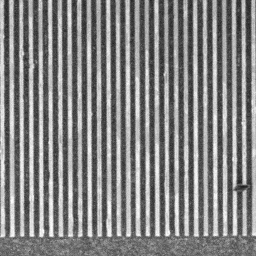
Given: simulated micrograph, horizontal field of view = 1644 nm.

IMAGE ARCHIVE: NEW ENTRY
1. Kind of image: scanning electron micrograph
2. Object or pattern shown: parallel lines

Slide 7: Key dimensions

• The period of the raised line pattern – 62.1 nm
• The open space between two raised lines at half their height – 41.7 nm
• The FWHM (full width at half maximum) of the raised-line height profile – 23.3 nm